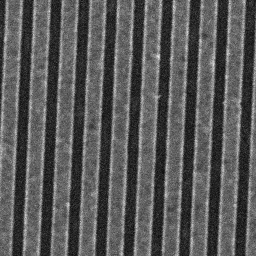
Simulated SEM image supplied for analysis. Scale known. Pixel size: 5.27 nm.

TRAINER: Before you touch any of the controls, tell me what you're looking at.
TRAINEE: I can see parallel lines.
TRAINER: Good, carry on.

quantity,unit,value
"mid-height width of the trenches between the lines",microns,0.0658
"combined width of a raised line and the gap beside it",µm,0.147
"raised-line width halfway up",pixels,15.1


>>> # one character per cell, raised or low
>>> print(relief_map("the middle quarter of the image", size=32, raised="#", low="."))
###...####...###....####...###..
###...####...###....####...###..
###...###....###....###....###..
###...###....###....###....###..
##....###....###....###....###..
##....###....###....###....###..
##....###....###....###....###..
##....###....###...####....###..
##....###....###...#####...###..
##....###....###...####....###..
##....###...####...####...####..
##....###...####...####...####..
##...####...####...####...####..
##...####...####...####...####..
##...####...####...####...####..
##...####...####...####...####..
##...####...####...####...####..
##...####...####...####...####..
##...####...####...####...####..
##...####...####...####...####..
##...####...####...####...####..
##...####...####...####...####..
##...####...###....####...####..
##...####...###....####...###...
##...####...###....####...###...
##...###....###....###....###...
##...###....###....###....###...
#....###....###....###....###...
#....###....###....###....###...
#....###....###....###....###...
#....###....###...####....###...
#....###....###...####....###...